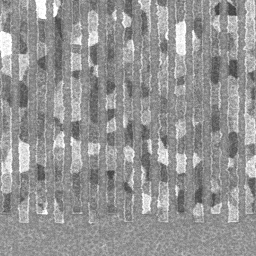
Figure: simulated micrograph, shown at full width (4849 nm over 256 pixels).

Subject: parallel lines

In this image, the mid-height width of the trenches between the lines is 149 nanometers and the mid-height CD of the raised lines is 170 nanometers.